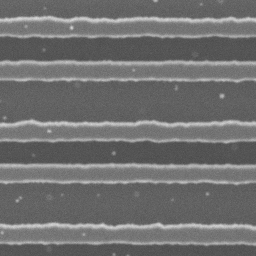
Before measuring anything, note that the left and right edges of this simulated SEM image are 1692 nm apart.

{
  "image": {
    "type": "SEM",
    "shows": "lines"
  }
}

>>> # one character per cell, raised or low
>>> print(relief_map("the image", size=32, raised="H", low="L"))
LLLLLLLLLLLLLLLLLLLLLLLLLLLLLLLL
LLLLLLLLLLLLLLLLLLLLLLLLLLLLLLLL
HHHHHHHHHHHHHHHHHHHHHHHHHHHHHHHH
HHHHHHHHHHHHHHHHHHHHHHHHHHHHHHHH
HHHHHHHHHHHHHHHHHHLHHHHHHHHHHHHH
LLLLLLLLLLLLLLLLLLLLLLLLLLLLLLLL
LLLLLLLLLLLLLLLLLLLLLLLLLLLLLLLL
LLLLLLLLLLLLLLLLLLLLLLLLLLLLLLLL
HHHHHHHHHHHHHHHHHHHHHHHHHHHHHHHH
HHHHHHHHHHHHHHHHHHHHHHHHHHHHHHHH
LLLLLLLLLLLLLLLLLLLLLLLLLLLLLLLL
LLLLLLLLLLLLLLLLLLLLLLLLLLLLLLLL
LLLLLLLLLLLLLLLLLLLLLLLLLLLLLLLL
LLLLLLLLLLLLLLLLLLLLLLLLLLLLLLLL
LLLLLLLLLLLLLLLLLLLLLLLLLLLLLLLL
HHHHHHHHHHHHHHHHHHHHHHHHHHHHHHHH
HHHHHHHHHHHHHHHHHHHHHHHHHHHHHHHH
HHHHHHHHHHHHHHHHHHHHHHHHHHHHHHHH
LLLLLLLLLLLLLLLLLLLLLLLLLLLLLLLL
LLLLLLLLLLLLLLLLLLLLLLLLLLLLLLLL
LLLLLLLLLLLLLLLLLLLLLLLLLLLLLLLL
HHHHHHHHHHHHHHHHHHHHHHHHHHHHHHHH
HHHHHHHHHHHHHHHHHHHHHHHHHHHHHHHH
LLLLLLLLLLLLLLLLLLLLLLLLLLLLLLLL
LLLLLLLLLLLLLLLLLLLLLLLLLLLLLLLL
LLLLLLLLLLLLLLLLLLLLLLLLLLLLLLLL
LLLLLLLLLLLLLLLLLLLLLLLLLLLLLLLL
LLLLLLLLLLLLLLLLLLLLLLLLLLLLLLLL
HHHHHHHHHHHHHHHHHHHHHHHHHHHHHHHH
HHHHHHHHHHHHHHHHHHHHHHHHHHHHHHHH
LHHLLHLHLLLHHLLLHHHHHHHHHHHHHHHH
LLLLLLLLLLLLLLLLLLLLLLLLLLLLLLLL